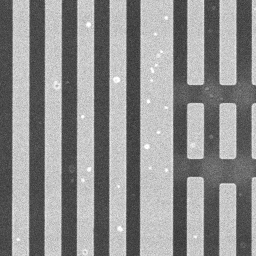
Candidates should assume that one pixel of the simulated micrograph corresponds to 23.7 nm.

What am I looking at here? groups of lines, slits or small figures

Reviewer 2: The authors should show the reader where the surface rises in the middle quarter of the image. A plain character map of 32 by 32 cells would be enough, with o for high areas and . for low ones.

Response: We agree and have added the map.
...oooo.....ooo....oooooooo....o
...oooo.....ooo....oooooooo....o
...oooo.....ooo....oooooooo....o
...oooo.....ooo....oooooooo....o
...oooo.....ooo....oooooooo....o
...oooo.....ooo....oooooooo.....
...oooo.....ooo....oooooooo.....
...oooo.....ooo....oooooooo.....
...oooo.....ooo....oooooooo.....
...oooo.....ooo....oooooooo.....
...oooo.....ooo....oooooooo....o
...oooo.....ooo....oooooooo....o
...oooo.....ooo....oooooooo....o
...oooo.....ooo....oooooooo....o
...oooo.....ooo....oooooooo....o
...oooo.....ooo....oooooooo....o
...oooo.....ooo....oooooooo....o
...oooo.....ooo....oooooooo....o
...oooo.....ooo....oooooooo....o
...oooo.....ooo....oooooooo....o
...oooo.....ooo....oooooooo....o
...oooo.....ooo....oooooooo....o
...oooo.....ooo....oooooooo....o
...oooo.....ooo....oooooooo....o
...oooo.....ooo....oooooooo.....
...oooo.....ooo....oooooooo.....
...oooo.....ooo....oooooooo.....
...oooo.....ooo....oooooooo.....
...oooo.....ooo....oooooooo....o
...oooo.....ooo....oooooooo....o
...oooo.....ooo....oooooooo....o
...oooo.....ooo....oooooooo....o